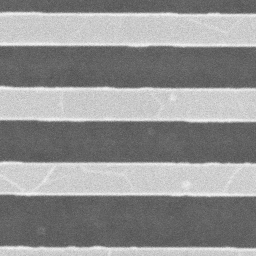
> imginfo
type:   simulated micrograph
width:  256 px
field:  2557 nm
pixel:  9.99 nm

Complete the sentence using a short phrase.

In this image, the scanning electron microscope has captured lines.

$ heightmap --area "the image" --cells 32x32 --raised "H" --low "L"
LLLLLLLLLLLLLLLLLLLLLLLLLLLLLLLL
LLLLLLLLLLLLLLLLLLLLLLLLLLLLLLLL
HHHHHHHHHHHHHHHHHHHHHHHHHHHHHHHH
HHHHHHHHHHHHHHHHHHHHHHHHHHHHHHHH
HHHHHHHHHHHHHHHHHHHHHHHHHHHHHHHH
HHHHHHHHHHHHHHHHHHHHHHHHHHHHHHHH
LLLLLLLLLLLLLLLLLLLLLLLLLLLLLLLL
LLLLLLLLLLLLLLLLLLLLLLLLLLLLLLLL
LLLLLLLLLLLLLLLLLLLLLLLLLLLLLLLL
LLLLLLLLLLLLLLLLLLLLLLLLLLLLLLLL
LLLLLLLLLLLLLLLLLLLLLLLLLLLLLLLL
HHHHHHHHHHHHHHHHHHHHHHHHHHHHHHHH
HHHHHHHHHHHHHHHHHHHHHHHHHHHHHHHH
HHHHHHHHHHHHHHHHHHHHHHHHHHHHHHHH
HHHHHHHHHHHHHHHHHHHHHHHHHHHHHHHH
LLLLLLLLLLLLLLLLLLLLLLLLLLLLLLLL
LLLLLLLLLLLLLLLLLLLLLLLLLLLLLLLL
LLLLLLLLLLLLLLLLLLLLLLLLLLLLLLLL
LLLLLLLLLLLLLLLLLLLLLLLLLLLLLLLL
LLLLLLLLLLLLLLLLLLLLLLLLLLLLLLLL
HHHHHHHHHHHHHHHHHHHHHHLLLLHLLLLL
HHHHHHHHHHHHHHHHHHHHHHHHHHHHHHHH
HHHHHHHHHHHHHHHHHHHHHHHHHHHHHHHH
HHHHHHHHHHHHHHHHHHHHHHHHHHHHHHHH
LLLLLLLLLLLLLLLLLLLLLLLLLLLLLLLL
LLLLLLLLLLLLLLLLLLLLLLLLLLLLLLLL
LLLLLLLLLLLLLLLLLLLLLLLLLLLLLLLL
LLLLLLLLLLLLLLLLLLLLLLLLLLLLLLLL
LLLLLLLLLLLLLLLLLLLLLLLLLLLLLLLL
LLLLLLLLLLLLLLLLLLLLLLLLLLLLLLLL
LLLLLLLLLLLLLLLLLLLLLLLLLLLLLLLL
HHHHHHHHHHHHHHHHHHHHHHHHHHHHHHHH